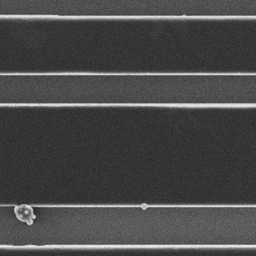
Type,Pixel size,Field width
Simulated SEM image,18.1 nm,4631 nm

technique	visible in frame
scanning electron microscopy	lines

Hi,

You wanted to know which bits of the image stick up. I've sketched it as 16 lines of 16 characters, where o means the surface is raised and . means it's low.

................
oooooooooooooooo
oooooooooooooooo
oooooooooooooooo
oooooooooooooooo
................
................
oooooooooooooooo
oooooooooooooooo
oooooooooooooooo
oooooooooooooooo
oooooooooooooooo
oooooooooooooooo
.o..............
................
oooooooooooooooo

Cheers